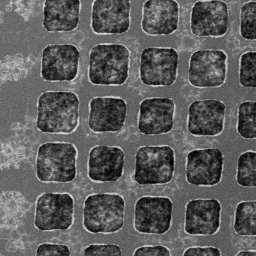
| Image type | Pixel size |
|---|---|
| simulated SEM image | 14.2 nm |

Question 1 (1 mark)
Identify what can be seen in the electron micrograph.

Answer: a regular array of holes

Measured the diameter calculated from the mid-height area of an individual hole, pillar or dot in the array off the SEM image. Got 40 px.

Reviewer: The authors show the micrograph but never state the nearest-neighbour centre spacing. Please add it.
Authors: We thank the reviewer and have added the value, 49.1 pixels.